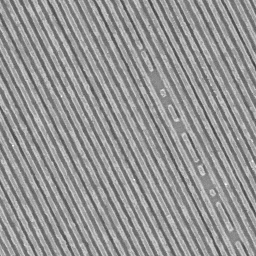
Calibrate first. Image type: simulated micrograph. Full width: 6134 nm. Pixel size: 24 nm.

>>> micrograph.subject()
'parallel lines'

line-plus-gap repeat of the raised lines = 0.197 micrometres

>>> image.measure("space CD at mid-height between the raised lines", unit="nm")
96.6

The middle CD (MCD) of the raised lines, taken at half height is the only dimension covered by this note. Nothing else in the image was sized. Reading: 94 nm